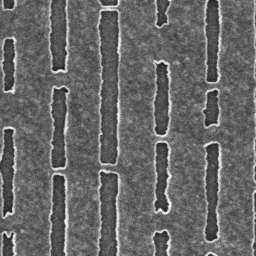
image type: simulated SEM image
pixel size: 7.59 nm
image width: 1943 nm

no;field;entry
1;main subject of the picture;parallel lines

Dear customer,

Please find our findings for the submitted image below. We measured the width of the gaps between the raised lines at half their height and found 99.6 nm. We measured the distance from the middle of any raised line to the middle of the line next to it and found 389 nm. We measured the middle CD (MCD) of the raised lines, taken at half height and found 284 nm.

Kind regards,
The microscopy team